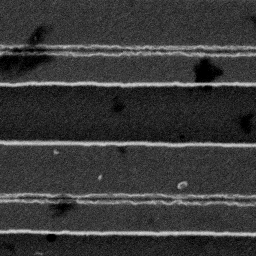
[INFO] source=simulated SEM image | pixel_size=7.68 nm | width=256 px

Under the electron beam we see lines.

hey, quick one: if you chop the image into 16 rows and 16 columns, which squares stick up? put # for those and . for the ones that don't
################
################
################
################
################
................
................
................
................
################
################
################
################
################
..##############
................